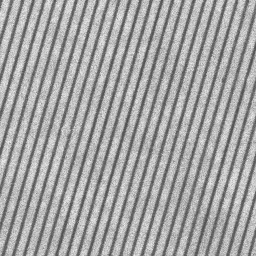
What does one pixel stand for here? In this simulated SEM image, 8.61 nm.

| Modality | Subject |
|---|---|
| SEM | parallel lines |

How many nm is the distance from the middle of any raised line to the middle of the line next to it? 88.6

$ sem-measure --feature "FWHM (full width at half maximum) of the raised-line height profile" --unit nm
64.1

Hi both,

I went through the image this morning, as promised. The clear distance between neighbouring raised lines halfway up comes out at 0.0238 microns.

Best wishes